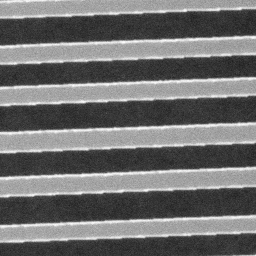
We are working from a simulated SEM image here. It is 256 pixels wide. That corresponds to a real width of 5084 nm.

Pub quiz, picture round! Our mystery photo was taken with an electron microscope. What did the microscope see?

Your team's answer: lines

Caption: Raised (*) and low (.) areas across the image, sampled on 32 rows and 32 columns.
********************************
*********************...........
................................
................................
................................
.........***********************
********************************
**************..................
................................
................................
.............*******************
********************************
****************................
................................
................................
................................
....****************************
********************************
**************..................
................................
................................
....................************
********************************
***************************.....
*...............................
................................
................................
.....................***********
********************************
*********************...........
................................
................................